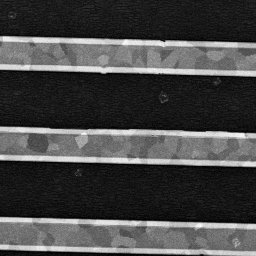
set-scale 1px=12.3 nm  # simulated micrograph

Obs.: one or a few lines or trenches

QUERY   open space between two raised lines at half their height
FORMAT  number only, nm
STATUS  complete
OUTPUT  765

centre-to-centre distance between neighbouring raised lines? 1110 nm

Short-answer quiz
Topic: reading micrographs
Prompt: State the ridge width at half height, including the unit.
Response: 345 nm